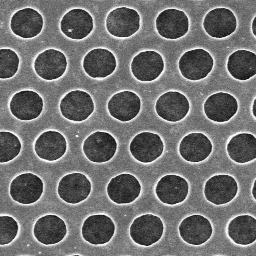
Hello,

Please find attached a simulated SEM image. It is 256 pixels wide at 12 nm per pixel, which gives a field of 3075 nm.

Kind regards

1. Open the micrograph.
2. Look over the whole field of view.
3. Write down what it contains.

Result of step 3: a regular array of holes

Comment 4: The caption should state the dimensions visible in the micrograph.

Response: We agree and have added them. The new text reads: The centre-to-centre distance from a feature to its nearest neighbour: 565 nm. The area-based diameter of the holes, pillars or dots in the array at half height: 382 nanometres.